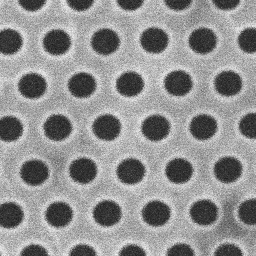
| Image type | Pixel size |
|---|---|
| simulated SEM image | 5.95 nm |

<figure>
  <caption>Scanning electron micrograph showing a regular array of holes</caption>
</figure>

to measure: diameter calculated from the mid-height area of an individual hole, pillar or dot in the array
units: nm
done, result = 172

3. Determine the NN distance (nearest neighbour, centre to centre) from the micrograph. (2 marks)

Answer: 286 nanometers